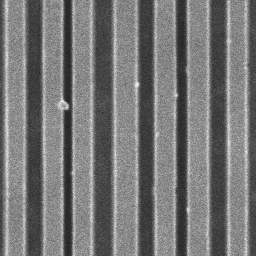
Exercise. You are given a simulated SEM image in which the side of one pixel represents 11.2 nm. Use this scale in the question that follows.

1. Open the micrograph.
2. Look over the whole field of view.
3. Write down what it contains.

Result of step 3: parallel lines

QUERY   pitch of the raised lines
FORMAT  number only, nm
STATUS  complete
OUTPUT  413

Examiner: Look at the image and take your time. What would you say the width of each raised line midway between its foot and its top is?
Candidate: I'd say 241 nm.